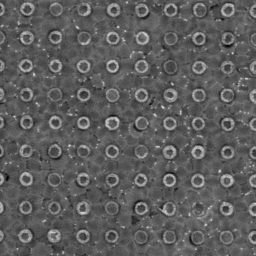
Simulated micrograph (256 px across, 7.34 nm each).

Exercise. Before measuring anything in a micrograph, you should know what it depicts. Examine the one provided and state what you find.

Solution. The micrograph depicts a regular array of raised bodies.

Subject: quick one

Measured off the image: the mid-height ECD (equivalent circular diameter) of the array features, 94.8 nm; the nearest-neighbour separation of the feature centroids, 206 nanometres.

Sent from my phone